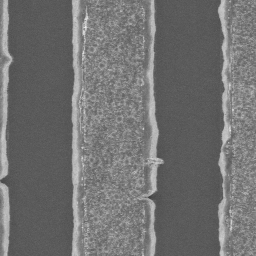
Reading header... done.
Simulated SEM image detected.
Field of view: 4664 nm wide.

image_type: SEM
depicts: one or a few lines or trenches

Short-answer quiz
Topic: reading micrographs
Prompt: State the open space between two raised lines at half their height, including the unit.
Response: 1280 nanometres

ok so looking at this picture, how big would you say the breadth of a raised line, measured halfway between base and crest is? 1410 nm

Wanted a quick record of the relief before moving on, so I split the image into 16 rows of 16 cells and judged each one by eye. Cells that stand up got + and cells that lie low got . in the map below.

.....+++++....++
.....+++++....++
.....+++++....++
+....+++++....++
.....++++.....++
.....++++.....++
.....++++.....++
.....+++++....++
.....+++++....++
.....+++++....++
.....+++++....++
.....+++++....++
.....++++.....++
.....+++++....++
.....+++++....++
.....+++++....++